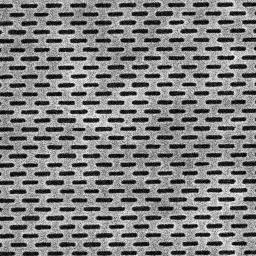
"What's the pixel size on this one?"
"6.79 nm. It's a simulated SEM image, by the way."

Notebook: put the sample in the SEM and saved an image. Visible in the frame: a regular array of holes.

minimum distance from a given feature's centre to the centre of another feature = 100 nm